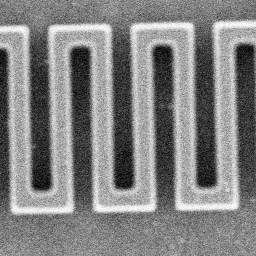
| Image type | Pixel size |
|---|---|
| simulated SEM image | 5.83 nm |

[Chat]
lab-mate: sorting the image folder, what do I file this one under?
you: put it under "groups of lines, slits or small figures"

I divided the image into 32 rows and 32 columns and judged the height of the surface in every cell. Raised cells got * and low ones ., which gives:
................................
................................
................................
..........***....*******...*****
***...********...*******...*****
***...********...**..***...**...
.**...***..***...**...**...**...
.**...**....**...**...**...**...
.**...**....**...**...**...**...
.**...***...**...**...**...**...
.**...***...**...**...**...**...
.***..***...**...**...**...**...
.***...**...**...**...**...**...
.***...**...**...**...**...**...
.***...**...**...**...**...**...
.***...**...**...**...**...**...
.***...**...**...**...**...**...
.***...**...**...**...**...**...
.***...**...**...**...**...**...
.***...**...**...**...**...**...
.***...**...**...**...**...**...
.***...**...**...**...**...**...
..**...**...**...**...**...**...
..**...**...**...**...***..**...
..*******...*******...*******...
..*******...*******...*******...
................................
................................
................................
................................
................................
................................